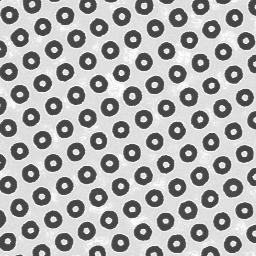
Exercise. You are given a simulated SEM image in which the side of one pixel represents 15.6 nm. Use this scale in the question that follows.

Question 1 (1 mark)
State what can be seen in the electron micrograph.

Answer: a regular array of ring-shaped grooves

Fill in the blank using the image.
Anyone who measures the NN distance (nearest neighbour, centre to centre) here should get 389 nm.